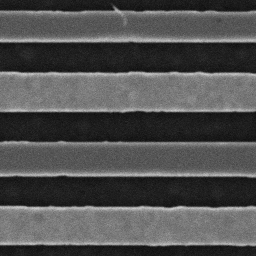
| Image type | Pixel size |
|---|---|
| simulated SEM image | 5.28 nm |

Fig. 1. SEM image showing lines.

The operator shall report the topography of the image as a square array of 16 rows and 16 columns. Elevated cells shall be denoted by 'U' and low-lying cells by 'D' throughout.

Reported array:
DDDDDDDDDDDDDDDD
UUUUUUUUUUUUUUUU
UUUUUUUUUUUUUUUU
DDDDDDDDDDDDDDDD
DDDDDDDDDDDDDDDD
UUUUUUUUUUUUUUUU
UUUUUUUUUUUUUUUU
DDDDDDDDDDDDDDDD
DDDDDDDDDDDDDDDD
UUUUUUUUUUUUUUUU
UUUUUUUUUUUUUUUU
DDDDDDDDDDDDDDDD
DDDDDDDDDDDDDDDD
UUUUUUUUUUUUUUUU
UUUUUUUUUUUUUUUU
DDDDDDDDDDDDDDDD